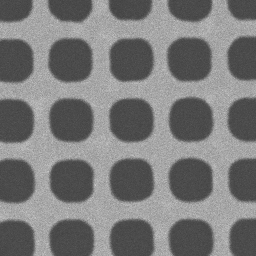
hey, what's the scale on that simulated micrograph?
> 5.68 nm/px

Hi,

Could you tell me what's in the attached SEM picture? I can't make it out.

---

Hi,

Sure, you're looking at a regular array of holes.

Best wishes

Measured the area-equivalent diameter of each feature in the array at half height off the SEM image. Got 265 nanometers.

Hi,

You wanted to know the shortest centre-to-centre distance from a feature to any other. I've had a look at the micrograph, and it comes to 59.5 px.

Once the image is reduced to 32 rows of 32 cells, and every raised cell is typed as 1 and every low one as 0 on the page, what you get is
00001100000011000001100000010000
00001100000111000001100000111000
00011110000111100011110001111100
11111111111111111111111111111111
11111111111111111111111111111100
00011110000111000001100000111000
00001100000011000001100000110000
00001100000011000001100000110000
00001100000011000001100000111000
00001110000111000001110000111000
11111111111111111111111111111111
11111111111111111111111111111111
00011110001111100011110001111100
00001100000111000001100000111000
00001100000011000001100000010000
00001100000011000001100000010000
00001100000011000001100000011000
00011110000111100011110000111100
11111111111111111111111111111111
11111111111111111111111111111111
00001110000111000001110000111000
00001100000011000001100000011000
00001100000011000001100000010000
00001100000011000001100000011000
00001110000111000001110000111000
11111111111111111111111111111111
11111111111111111111111111111111
10111111001111100011110001111100
00001100000111000001100000111000
00001100000011000001100000011000
00001100000011000001100000011000
00001100000011000001100000011000